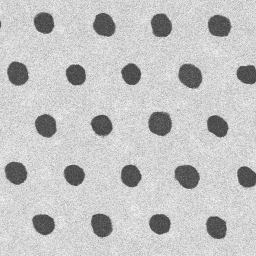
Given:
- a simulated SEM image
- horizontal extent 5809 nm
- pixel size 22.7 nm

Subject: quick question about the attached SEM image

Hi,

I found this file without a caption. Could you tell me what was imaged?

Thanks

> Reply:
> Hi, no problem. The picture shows a regular array of holes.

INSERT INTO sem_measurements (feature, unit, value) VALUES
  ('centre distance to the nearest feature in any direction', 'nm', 1280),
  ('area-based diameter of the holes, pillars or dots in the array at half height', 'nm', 503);